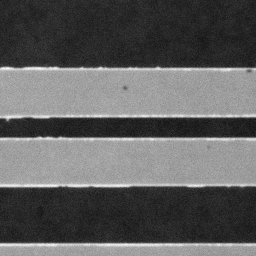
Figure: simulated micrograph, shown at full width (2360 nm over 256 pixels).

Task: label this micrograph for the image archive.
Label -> lines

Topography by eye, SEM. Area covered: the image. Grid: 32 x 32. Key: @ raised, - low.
--------------------------------
--------------------------------
--------------------------------
--------------------------------
--------------------------------
--------------------------------
--------------------------------
--------------------------------
@@-@@--@------------------------
@@@@@@@@@@@@@@@@@@@@@@@@@@@@@@@@
@@@@@@@@@@@@@@@@@@@@@@@@@@@@@@@@
@@@@@@@@@@@@@@@@@@@@@@@@@@@@@@@@
@@@@@@@@@@@@@@@@@@@@@@@@@@@@@@@@
@@@@@@@@@@@@@@@@@@@@@@@@@@@@@@@@
@@@@@@@@@@@@@@@@@@@@@@@@@@@@@@@@
--------------------------------
--------------------------------
@@@@@@@@@@@@@@@@@@@@@@@@@@@@@@@@
@@@@@@@@@@@@@@@@@@@@@@@@@@@@@@@@
@@@@@@@@@@@@@@@@@@@@@@@@@@@@@@@@
@@@@@@@@@@@@@@@@@@@@@@@@@@@@@@@@
@@@@@@@@@@@@@@@@@@@@@@@@@@@@@@@@
@@@@@@@@@@@@@@@@@@@@@@@@@@@@@@@@
--------------------------------
--------------------------------
--------------------------------
--------------------------------
--------------------------------
--------------------------------
--------------------------------
--------------------------------
@@@@@@@@@@@@@@@@@@@@@@@@@@@@@@@@